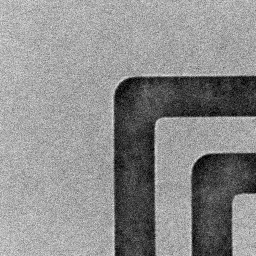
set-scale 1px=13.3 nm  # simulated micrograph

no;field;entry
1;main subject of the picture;groups of lines, slits or small figures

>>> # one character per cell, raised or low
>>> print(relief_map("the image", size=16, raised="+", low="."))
++++++++++++++++
++++++++++++++++
++++++++++++++++
++++++++++++++++
++++++++++++++++
+++++++.........
+++++++.........
+++++++...++++++
+++++++...++++++
+++++++...+++++.
+++++++...++....
+++++++...++....
+++++++...++...+
+++++++...++...+
+++++++...++...+
+++++++...++...+